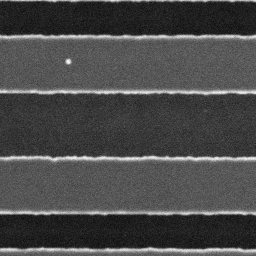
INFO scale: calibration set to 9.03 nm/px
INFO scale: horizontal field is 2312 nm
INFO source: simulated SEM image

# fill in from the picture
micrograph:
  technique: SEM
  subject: lines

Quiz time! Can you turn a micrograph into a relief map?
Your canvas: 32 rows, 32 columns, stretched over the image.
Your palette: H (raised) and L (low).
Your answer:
LLLLLLLLLLLLLLLLLLLLLLLLLLLLLLLL
LLLLLLLLLLLLLLLLLLLLLLLLLLLLLLLL
LLLLLLLLLLLLLLLLLLLLLLLLLLLLLLLL
LLLLLLLLLLLLLLLLLLLLLLLLLLLLLLLL
HHHHHHHHHHHHHHLHHHHHHLHHHHHHHHLH
HHHHHHHHHHHHHHHHHHHHHHHHHHHHHHHH
HHHHHHHHHHHHHHHHHHHHHHHHHHHHHHHH
HHHHHHHHHHHHHHHHHHHHHHHHHHHHHHHH
HHHHHHHHHHHHHHHHHHHHHHHHHHHHHHHH
HHHHHHHHHHHHHHHHHHHHHHHHHHHHHHHH
HHHHHHHHHHHHHHHHHHHHHHHHHHHHHHHH
HHHHHHHHHHHHHHHHHHHHHHHHHHHHHHHH
LLLLLLLLLLLLLLLLLLLLLLLLLLLLLLLL
LLLLLLLLLLLLLLLLLLLLLLLLLLLLLLLL
LLLLLLLLLLLLLLLLLLLLLLLLLLLLLLLL
LLLLLLLLLLLLLLLLLLLLLLLLLLLLLLLL
LLLLLLLLLLLLLLLLLLLLLLLLLLLLLLLL
LLLLLLLLLLLLLLLLLLLLLLLLLLLLLLLL
LLLLLLLLLLLLLLLLLLLLLLLLLLLLLLLL
LLLLLLLLLLLLLLLLLLLLLLLLLLLLLLLL
HHHHHHHHHHHHHHHHHHHHHHHHHHHHHHHH
HHHHHHHHHHHHHHHHHHHHHHHHHHHHHHHH
HHHHHHHHHHHHHHHHHHHHHHHHHHHHHHHH
HHHHHHHHHHHHHHHHHHHHHHHHHHHHHHHH
HHHHHHHHHHHHHHHHHHHHHHHHHHHHHHHH
HHHHHHHHHHHHHHHHHHHHHHHHHHHHHHHH
HHHHHHHHHHHHHHHHHHHHHHHHHHHHHHHH
LLLLLLLLLLLLLLLLLLLLLLLLLLLLLLLL
LLLLLLLLLLLLLLLLLLLLLLLLLLLLLLLL
LLLLLLLLLLLLLLLLLLLLLLLLLLLLLLLL
LLLLLLLLLLLLLLLLLLLLLLLLLLLLLLLL
HHHHHHHHHHHHHHHHHHHHHHHHHHHHHHHH